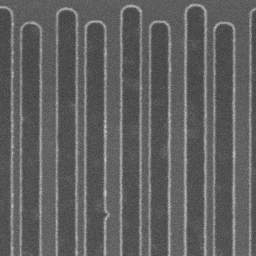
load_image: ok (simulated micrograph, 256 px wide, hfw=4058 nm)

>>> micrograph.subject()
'parallel lines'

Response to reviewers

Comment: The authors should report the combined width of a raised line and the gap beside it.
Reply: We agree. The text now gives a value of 510 nanometres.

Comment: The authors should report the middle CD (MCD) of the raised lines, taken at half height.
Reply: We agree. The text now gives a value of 315 nm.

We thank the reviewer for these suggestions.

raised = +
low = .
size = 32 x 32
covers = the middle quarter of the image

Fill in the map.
+++..+++++....+++++...++++....++
+++...++++.....++++...++++....++
+++...++++....+++++...++++....++
+++...++++....+++++...++++....++
+++...++++....+++++..+++++....++
+++...++++....+++++...++++....++
+++...++++....+++++...++++....++
+++...++++....+++++..+++++....++
+++...++++.....++++..+++++....++
+++...++++.....++++...++++....++
+++...++++....+++++...++++....++
+++..+++++....+++++...++++....++
+++..+++++.....++++...++++....++
+++..+++++.....++++...++++....++
+++..+++++....+++++...++++....++
+++..+++++....+++++..+++++....++
+++..+++++....+++++...++++....++
+++..+++++....+++++...++++....++
+++..+++++....+++++...++++....++
+++..+++++....+++++..+++++....++
+++..+++++....+++++..+++++....++
+++..+++++....+++++...++++....++
+++..+++++....+++++..+++++....++
+++..+++++....+++++..+++++....++
+++..+++++....+++++..+++++....++
+++..+++++....+++++..+++++....++
+++..+++++....+++++..+++++....++
+++..+++++....+++++..+++++....++
+++..+++++....+++++..+++++....++
+++..+++++....+++++..+++++....++
+++..+++++....+++++...++++....++
+++..+++++....+++++...++++.....+